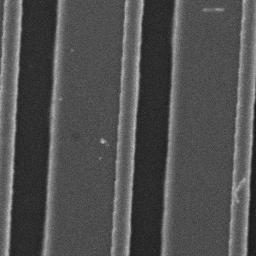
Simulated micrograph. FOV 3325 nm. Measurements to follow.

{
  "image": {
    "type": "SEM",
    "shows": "lines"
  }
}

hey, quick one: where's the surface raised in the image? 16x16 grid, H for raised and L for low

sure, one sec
HLLLHHHHHLLHHHHH
HLLLHHHHHLLHHHHH
HLLLHHHHHLLHHHHH
HLLLHHHHHLLHHHHH
HLLHHHHHHLLHHHHH
HLLHHHHHHLLHHHHH
HLLHHHHHHLLHHHHH
HLLHHHHHHLLHHHHH
HLLHHHHHLLLHHHHH
HLLHHHHHLLLHHHHH
HLLHHHHHLLLHHHHH
HLLHHHHHLLHHHHHH
HLLHHHHHLLHHHHHH
HLLHHHHHLLHHHHHL
HLLHHHHHLLHHHHHL
HLLHHHHHLLHHHHHL